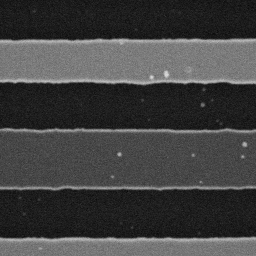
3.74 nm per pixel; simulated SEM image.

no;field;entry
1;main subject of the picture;lines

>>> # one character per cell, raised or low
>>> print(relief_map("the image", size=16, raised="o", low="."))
................
................
......oo..ooo.oo
oooooooooooooooo
oooooooooooooooo
................
................
................
oooooooooooooooo
oooooooooooooooo
oooooooooooooooo
oooooooooooooooo
................
................
................
oooooooooooooooo